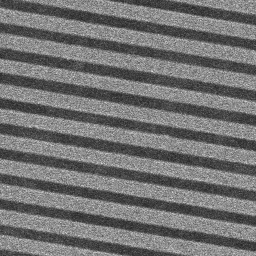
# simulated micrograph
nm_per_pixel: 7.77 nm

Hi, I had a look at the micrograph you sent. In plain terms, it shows parallel lines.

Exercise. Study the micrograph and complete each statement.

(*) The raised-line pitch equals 193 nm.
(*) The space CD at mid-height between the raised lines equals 85.2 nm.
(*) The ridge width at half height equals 107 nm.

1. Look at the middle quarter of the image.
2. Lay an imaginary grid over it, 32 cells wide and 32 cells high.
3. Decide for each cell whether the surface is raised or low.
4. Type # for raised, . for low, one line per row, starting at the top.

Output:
............####################
..................##############
######..................########
############..................##
##################..............
.....##################.........
...........##################...
.................###############
#####..................#########
###########..................###
#################...............
...####################.........
.........####################...
...............#################
####.................###########
##########.................#####
################................
.#####################..........
.......####################.....
.............###################
#..................#############
#######...................######
##############.................#
##################..............
......##################........
............##################..
..................##############
######..................########
############..................##
##################..............
....####################........
..........####################..